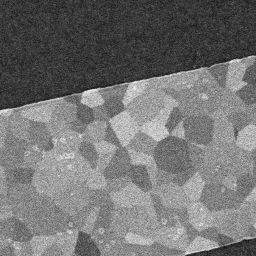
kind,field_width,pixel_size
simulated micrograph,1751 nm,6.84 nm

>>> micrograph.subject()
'one or a few lines or trenches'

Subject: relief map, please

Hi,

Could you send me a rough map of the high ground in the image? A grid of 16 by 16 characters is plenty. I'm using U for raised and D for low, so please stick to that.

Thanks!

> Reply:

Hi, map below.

DDDDDDDDDDDDDDDD
DDDDDDDDDDDDDDDD
DDDDDDDDDDDDDDDD
DDDDDDDDDDDDDDDD
DDDDDDDDDDDDUUUU
DDDDDDDUUUUUUUUU
DDUUUUUUUUUUUUUU
UUUUUUUUUUUUUUUU
UUUUUUUUUUUUUUUU
UUUUUUUUUUUUUUUU
UUUUUUUUUUUUUUUU
UUUUUUUUUUUUUUUU
UUUUUUUUUUUUUUUU
UUUUUUUUUUUUUUUU
UUUUUUUUUUUUUUUU
UUUUUUUUUUUUUDDD